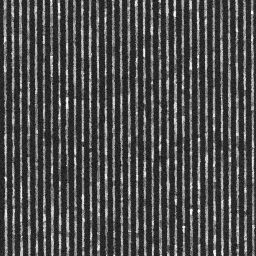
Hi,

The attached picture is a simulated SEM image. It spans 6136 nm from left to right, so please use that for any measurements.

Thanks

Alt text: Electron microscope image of parallel lines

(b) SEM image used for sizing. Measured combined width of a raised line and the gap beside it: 185 nanometres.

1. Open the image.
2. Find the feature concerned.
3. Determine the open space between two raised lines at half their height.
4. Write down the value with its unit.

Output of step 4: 150 nm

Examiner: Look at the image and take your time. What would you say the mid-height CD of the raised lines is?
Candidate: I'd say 33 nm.